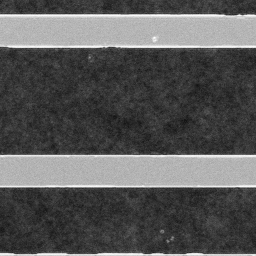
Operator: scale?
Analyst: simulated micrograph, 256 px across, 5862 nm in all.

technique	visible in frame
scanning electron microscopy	lines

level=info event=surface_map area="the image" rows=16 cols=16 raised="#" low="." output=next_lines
................
################
################
................
................
................
................
................
................
................
################
################
................
................
................
................